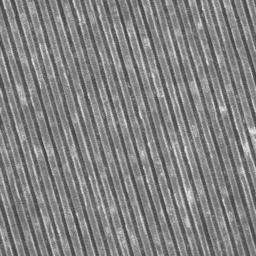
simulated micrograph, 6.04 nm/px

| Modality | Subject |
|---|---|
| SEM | parallel lines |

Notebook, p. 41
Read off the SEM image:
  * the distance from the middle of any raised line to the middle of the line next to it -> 67.2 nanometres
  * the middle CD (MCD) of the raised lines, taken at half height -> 37.7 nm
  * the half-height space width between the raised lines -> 26.8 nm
